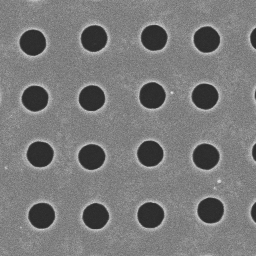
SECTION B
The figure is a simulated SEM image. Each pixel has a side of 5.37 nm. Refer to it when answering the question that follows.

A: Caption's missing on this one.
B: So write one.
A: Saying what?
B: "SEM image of a regular array of holes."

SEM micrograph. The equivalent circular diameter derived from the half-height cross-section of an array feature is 138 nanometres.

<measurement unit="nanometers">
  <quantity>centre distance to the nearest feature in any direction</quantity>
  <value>290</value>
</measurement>